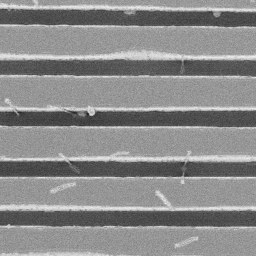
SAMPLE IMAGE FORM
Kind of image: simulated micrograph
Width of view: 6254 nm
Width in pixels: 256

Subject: lines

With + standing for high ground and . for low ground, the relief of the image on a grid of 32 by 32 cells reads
++++++++++++++++++++++++++++++++
................................
................................
++++++++++++++++++++++++++++++++
++++++++++++++++++++++++++++++++
++++++++++++++++++++++++++++++++
++++++++++++++++++++++++++++++++
................................
................................
+++++++++........++.............
++++++++++++++++++++++++++++++++
++++++++++++++++++++++++++++++++
++++++++++++++++++++++++++++++++
++++++++++++++++++++++++++++++++
................................
................................
++++++++++++++++++++++++++++++++
++++++++++++++++++++++++++++++++
++++++++++++++++++++++++++++++++
++++++++++++++++++++++++++++++++
................................
................................
++++++++++++++++++++++++++++++++
++++++++++++++++++++++++++++++++
++++++++++++++++++++++++++++++++
++++++++++++++++++++++++++++++++
................................
................................
++++++++++++++++++++++++++++++++
++++++++++++++++++++++++++++++++
++++++++++++++++++++++++++++++++
++++++++++++++++++++++++++++++++